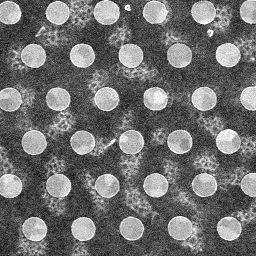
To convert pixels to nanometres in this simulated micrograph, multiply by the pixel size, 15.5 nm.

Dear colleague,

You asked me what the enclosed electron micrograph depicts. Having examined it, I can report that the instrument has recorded a regular array of raised bodies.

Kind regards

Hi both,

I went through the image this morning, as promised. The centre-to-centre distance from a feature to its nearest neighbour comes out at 752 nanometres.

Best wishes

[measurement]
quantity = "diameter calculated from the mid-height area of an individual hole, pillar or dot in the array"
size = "0.368 microns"